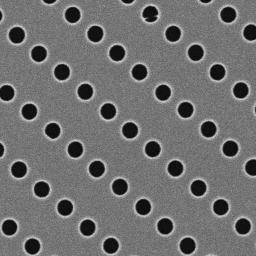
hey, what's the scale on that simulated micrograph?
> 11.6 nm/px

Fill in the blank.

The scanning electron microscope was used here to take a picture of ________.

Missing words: a regular array of holes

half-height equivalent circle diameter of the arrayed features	16.1	px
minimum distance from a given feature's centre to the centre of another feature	0.342	microns